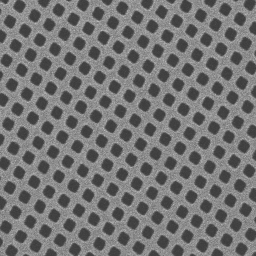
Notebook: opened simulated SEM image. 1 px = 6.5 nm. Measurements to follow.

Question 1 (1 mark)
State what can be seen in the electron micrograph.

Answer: a regular array of holes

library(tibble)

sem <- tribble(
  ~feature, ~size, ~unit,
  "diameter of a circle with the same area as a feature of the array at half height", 81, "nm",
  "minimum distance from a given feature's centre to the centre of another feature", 113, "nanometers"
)